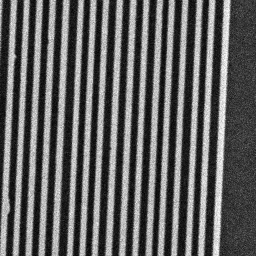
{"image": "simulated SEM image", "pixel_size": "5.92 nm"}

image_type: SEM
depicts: parallel lines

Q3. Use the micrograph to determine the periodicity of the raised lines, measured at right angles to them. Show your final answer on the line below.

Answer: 78.7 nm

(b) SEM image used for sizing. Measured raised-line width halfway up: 33.3 nanometres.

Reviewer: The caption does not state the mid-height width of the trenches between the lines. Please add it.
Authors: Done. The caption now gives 44.3 nanometers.